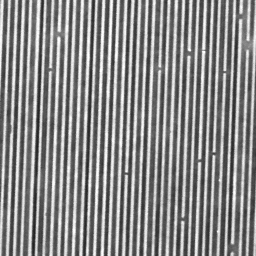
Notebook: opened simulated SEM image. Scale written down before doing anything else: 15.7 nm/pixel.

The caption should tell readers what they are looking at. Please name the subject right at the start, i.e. parallel lines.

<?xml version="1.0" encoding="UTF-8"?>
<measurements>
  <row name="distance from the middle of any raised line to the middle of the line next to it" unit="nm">114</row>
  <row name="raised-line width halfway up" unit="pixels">2.5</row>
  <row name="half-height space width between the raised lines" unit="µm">0.0805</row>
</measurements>